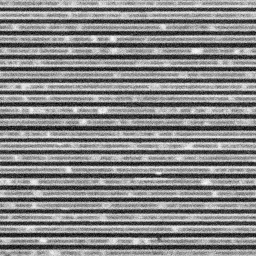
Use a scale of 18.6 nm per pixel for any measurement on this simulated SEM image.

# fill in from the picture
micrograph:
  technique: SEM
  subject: parallel lines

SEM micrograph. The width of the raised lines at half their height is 0.102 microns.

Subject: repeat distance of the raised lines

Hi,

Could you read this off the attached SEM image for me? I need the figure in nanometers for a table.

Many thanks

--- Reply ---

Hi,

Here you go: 220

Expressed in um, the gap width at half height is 0.116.